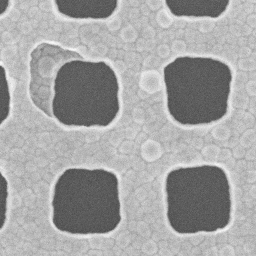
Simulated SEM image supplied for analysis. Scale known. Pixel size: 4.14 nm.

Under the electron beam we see holes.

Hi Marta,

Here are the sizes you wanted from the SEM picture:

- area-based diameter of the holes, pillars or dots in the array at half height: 297 nm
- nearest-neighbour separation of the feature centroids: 457 nm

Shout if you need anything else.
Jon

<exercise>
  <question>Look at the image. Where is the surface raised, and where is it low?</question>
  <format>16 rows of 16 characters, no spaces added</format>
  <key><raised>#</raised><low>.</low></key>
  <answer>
####...####...##
################
################
##...###########
##.....###....##
.#.....###....##
.#.....###....##
###....####...##
################
################
###########...##
###....###....##
###....###.....#
###.....##....##
####...####..###
################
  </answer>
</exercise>